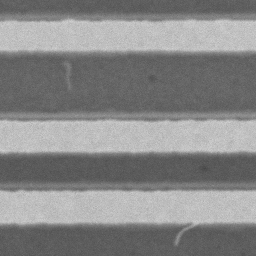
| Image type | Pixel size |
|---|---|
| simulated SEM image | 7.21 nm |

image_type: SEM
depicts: lines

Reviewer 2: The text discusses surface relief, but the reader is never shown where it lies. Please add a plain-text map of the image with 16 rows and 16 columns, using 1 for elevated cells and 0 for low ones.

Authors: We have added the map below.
0000000000000000
1111111111111111
1111111111111111
0000000000000000
0000000000000000
0000000000000000
0000000000000000
1111111111111111
1111111111111111
1110111110010110
0000000000000000
0000000000000000
1111111111111111
1111111111111111
0000000000000000
0000000000000000